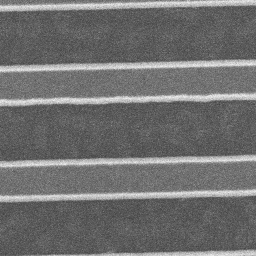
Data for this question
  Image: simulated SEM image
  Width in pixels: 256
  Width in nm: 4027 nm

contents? one or a few lines or trenches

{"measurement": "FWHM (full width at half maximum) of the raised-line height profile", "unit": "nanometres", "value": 562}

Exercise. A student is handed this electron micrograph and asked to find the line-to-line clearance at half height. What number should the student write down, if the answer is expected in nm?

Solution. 922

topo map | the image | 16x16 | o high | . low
ooo.............
................
................
................
oooooooooooooooo
oooooooooooooooo
................
................
................
................
oooooooooooooooo
oooooooooooooooo
................
................
................
................